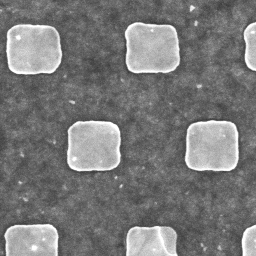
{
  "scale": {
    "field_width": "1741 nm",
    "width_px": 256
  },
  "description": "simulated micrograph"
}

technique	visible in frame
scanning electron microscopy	raised bodies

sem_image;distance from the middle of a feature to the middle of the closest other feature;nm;772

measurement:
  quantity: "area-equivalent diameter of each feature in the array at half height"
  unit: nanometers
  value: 374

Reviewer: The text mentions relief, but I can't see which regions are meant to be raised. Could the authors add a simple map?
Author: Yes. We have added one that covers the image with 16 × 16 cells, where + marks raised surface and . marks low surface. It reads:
................
................
.+++....+++....+
.+++....+++....+
.++.....++......
................
................
................
....+++.....+++.
....+++.....+++.
.....++.....++..
................
................
................
+++.....++.....+
++++....++.....+